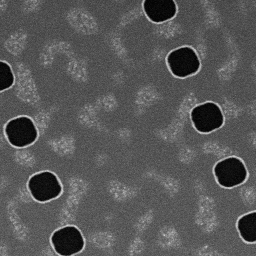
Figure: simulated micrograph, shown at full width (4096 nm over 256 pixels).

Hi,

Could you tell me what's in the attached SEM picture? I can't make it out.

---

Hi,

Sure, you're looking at holes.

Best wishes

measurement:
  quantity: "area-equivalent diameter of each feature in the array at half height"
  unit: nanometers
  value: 500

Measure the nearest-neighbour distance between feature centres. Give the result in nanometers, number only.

955